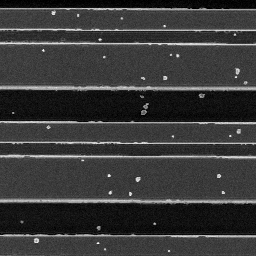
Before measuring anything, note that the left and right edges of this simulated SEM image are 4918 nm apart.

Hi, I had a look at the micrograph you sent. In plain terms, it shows lines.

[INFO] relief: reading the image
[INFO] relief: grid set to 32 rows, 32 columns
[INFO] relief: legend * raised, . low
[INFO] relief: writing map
................................
********************************
********************************
********************************
********************************
********************************
********************************
********************************
********************************
********************************
********************************
................................
................................
................................
................................
********************************
********************************
********************************
********************************
********************************
********************************
********************************
********************************
********************************
********************************
................................
................................
................................
................................
******************************..
********************************
********************************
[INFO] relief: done